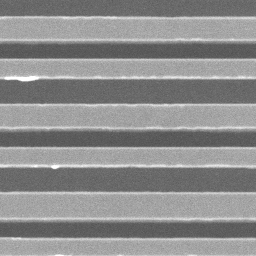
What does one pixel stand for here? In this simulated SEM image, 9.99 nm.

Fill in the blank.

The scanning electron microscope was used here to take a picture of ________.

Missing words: lines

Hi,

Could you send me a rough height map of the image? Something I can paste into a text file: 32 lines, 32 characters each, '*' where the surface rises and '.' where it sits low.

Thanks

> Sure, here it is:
................................
................................
********************************
********************************
********************************
................................
................................
********************************
********************************
********************************
................................
................................
................................
********************************
********************************
********************************
................................
................................
********************************
********************************
********************************
................................
................................
................................
********************************
********************************
********************************
................................
................................
................................
********************************
********************************